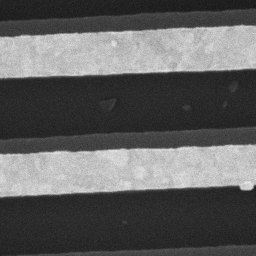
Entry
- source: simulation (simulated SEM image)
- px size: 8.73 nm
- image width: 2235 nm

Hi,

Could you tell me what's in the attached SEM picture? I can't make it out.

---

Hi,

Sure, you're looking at lines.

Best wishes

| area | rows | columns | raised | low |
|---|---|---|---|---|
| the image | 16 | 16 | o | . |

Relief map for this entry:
................
oooooooooooooooo
oooooooooooooooo
oooooooooooooooo
oooooooooo......
................
................
................
.....ooooooooooo
oooooooooooooooo
oooooooooooooooo
oooooooooooooooo
................
................
................
............oooo